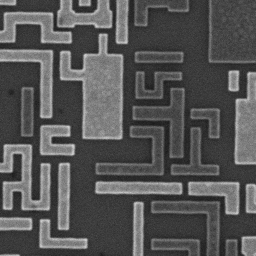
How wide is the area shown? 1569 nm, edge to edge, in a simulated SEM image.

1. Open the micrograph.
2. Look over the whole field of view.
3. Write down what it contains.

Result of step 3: wiring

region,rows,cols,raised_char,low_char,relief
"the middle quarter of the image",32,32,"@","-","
@----@@@@@@@@@@-----------------
@@--@@@@@@@@@@@-----------------
@@@@@@@@@@@@@@----@@---@@@@@@---
@@@@@@@@@@@@@@----@@---@@@@@@---
-----@@@@@@@@@----@@---@@-------
-----@@@@@@@@@----@@---@--------
-----@@@@@@@@@----@@@--@@--@@@--
-----@@@@@@@@@----@@@@@@@--@@@--
-----@@@@@@@@@-------------@@@--
-----@@@@@@@@@-------------@@@--
-----@@@@@@@@@------------@@@@--
-----@@@@@@@@@---@@@@@@@@@@@@@--
-----@@@@@@@@@---@@@@@@@@@@@@@--
-----@@@@@@@@@---@@@@@@@@@@@@@--
-----@@@@@@@@@-------------@@@--
-----@@@@@@@@@-------------@@@--
@----@@@@@@@@@---@@@@@@@@--@@@--
@----@@@@@@@@@---@@@@@@@@--@@@--
-----@@@@@@@@@--------@@@--@@@--
----------------------@@@--@@@--
@@--------------------@@@--@@@--
@@--------------------@@@--@@@--
@@--------------------@@@--@@@--
----------------------@@@-------
----------------------@@@-------
@-------@@@@@@@@@@@@@@@@@--@@@@@
@-------@@@@@@@@@@@@@@@@@--@@@@@
@-------@@@@@@@@@@@@@@@@@--@@@@@
@-------------------------------
@-------@@--@@------------------
@-------@@@@@@@@@@@@@@@@@@@@@--@
@-------@@@@@@@@@@@@@@@@@@@@@--@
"